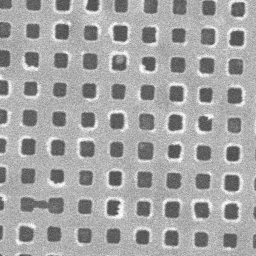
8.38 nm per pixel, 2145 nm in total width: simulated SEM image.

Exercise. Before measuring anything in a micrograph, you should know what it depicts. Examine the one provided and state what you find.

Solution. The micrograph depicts a regular array of holes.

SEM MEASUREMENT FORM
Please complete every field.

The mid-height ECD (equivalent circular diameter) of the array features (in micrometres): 0.141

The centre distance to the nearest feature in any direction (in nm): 239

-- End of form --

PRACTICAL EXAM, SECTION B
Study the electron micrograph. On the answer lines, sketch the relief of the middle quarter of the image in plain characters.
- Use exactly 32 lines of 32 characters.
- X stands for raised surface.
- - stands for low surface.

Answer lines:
-XXXX---XXXX----XXXX---XXX----XX
XXXXXX--XXXX---XXXXX---XXX----XX
XXXXXXXXXXXXXXXXXXXXXXXXXXXX-XXX
XXXXXXXXXXXXXXXXXXXXXXXXXXXXXXXX
XXXXXXXXXXXXXXXXXXXXXXXXXXXXXXXX
-XXX----XXXX---XXXX----XXXX--XXX
-XXX----XXXX----XXX----XXX----XX
-XXX----XXXX----XXX----XXX----XX
XXXXX---XXXX---XXXX----XXX----XX
XXXXXXXXXXXXXXXXXXXXXXXXXXX--XXX
XXXXXXXXXXXXXXXXXXXXXXXXXXXXXXXX
XXXXXXXXXXXXXXXXXXXXXXXXXXXXXXXX
XXXX---XXXXX---XXXX---XXXXX-XXXX
-XXX----XXX----XXXX----XXX----XX
-XXX----XXX----XXXX----XXX----XX
XXXX----XXX----XXXX----XXX----XX
XXXXXXXXXXXXXXXXXXXX--XXXX---XXX
XXXXXXXXXXXXXXXXXXXXXXXXXXXXXXXX
XXXXXXXXXXXXXXXXXXXXXXXXXXXXXXXX
XXXX---XXXXX--XXXXX---XXXXXXXXXX
-XXX----XXX----XXX-----XXX---XXX
-XXX----XXX----XXX-----XXX---XXX
XXXX----XXX----XXX-----XXX---XXX
XXXXXXXXXXXXXXXXXXX---XXXX---XXX
XXXXXXXXXXXXXXXXXXXXXXXXXXXXXXXX
XXXXXXXXXXXXXXXXXXXXXXXXXXXXXXXX
XXXX--XXXXXXXXXXXXXXXXXXXXXXXXXX
XXXX---XXXX----XXX----XXXX---XXX
XXXX---XXXX----XXX----XXX----XXX
XXXX---XXXX----XXX----XXX----XXX
XXXXXXXXXXXX--XXXX----XXX----XXX
XXXXXXXXXXXXXXXXXXXXXXXXXXXXXXXX